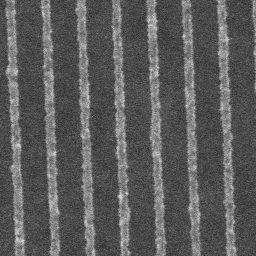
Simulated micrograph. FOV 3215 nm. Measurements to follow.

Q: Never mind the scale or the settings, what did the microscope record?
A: parallel lines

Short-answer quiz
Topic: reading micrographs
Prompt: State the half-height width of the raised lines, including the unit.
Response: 91 nanometres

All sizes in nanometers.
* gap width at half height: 348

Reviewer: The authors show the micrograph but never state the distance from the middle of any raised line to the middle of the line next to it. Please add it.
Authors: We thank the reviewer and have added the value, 442 nanometers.